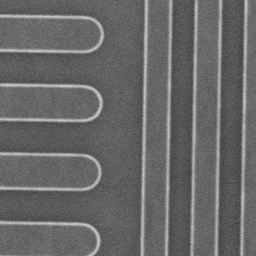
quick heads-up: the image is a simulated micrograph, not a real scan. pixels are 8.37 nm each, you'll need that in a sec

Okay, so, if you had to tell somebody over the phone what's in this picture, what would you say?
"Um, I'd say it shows groups of lines, slits or small figures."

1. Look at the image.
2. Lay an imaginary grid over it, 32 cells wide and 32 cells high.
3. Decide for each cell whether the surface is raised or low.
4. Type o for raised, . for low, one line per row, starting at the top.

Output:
..................ooo...oooo...o
..................ooo...oooo...o
oooooooooooo......ooo...ooo....o
ooooooooooooo.....ooo...ooo....o
ooooooooooooo.....ooo...ooo....o
oooooooooooo......ooo...ooo....o
.........oo.......ooo...ooo....o
..................ooo...ooo....o
..................ooo...ooo....o
..................ooo...ooo....o
..................ooo...ooo....o
oooooooooooo......ooo...ooo....o
ooooooooooooo.....ooo...ooo....o
ooooooooooooo.....ooo...ooo....o
oooooooooooo......ooo...ooo...oo
..................ooo...ooo...oo
..................ooo...ooo...oo
..................ooo...ooo...oo
..................ooo...ooo...oo
ooooooooooo.......ooo...ooo...oo
oooooooooooo......ooo...ooo...oo
ooooooooooooo.....ooo...ooo...oo
oooooooooooo......ooo...ooo...oo
ooooooooooo.......ooo...ooo...oo
..................ooo...ooo...oo
..................ooo...ooo...oo
..................ooo...ooo...oo
..................ooo...ooo...oo
oooooooooooo......ooo...ooo...oo
oooooooooooo......ooo...ooo...oo
oooooooooooo......ooo...ooo...oo
oooooooooooo......ooo...ooo...oo